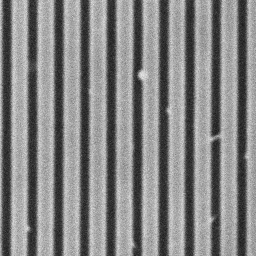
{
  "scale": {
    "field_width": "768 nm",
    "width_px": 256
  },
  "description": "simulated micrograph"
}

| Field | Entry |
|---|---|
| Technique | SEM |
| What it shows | parallel lines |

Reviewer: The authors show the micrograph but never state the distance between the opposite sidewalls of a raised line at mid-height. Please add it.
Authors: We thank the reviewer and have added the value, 48.4 nm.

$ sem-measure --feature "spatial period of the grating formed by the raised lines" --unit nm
78.6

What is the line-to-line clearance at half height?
31.5 nanometres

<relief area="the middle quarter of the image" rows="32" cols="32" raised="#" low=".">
####...###...####...####..####..
####...###...####...####..####..
####...###...####..#####..####..
####...###...####..#####..####..
####...###...####...####..####..
####...###...####...####..####..
####...###...####...####..####..
####...###...####...####..####..
####...###...####...####..####..
####...###...####...####..####..
####...###...####...####..####..
####...###...####...###...####..
####...###...####...###...####..
####...###...####...###...####..
####...####..####...###...####..
####...####..####...###...####..
####...####..####...###...####..
####...###...####...###...####..
####...###...####...###...####..
####...####..####...###...####..
####...####..####...###...####..
####...####..####...###...####..
####..#####..####...###...####..
####..#####..####...###...####..
####..#####..####...###...####..
####..#####..####...###...####..
####..#####..####...###...####..
####..#####..####...###...####..
####..#####..####...###...####..
####..#####..####...###...####..
####..#####..####...###...####..
####..#####..####...###...####..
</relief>